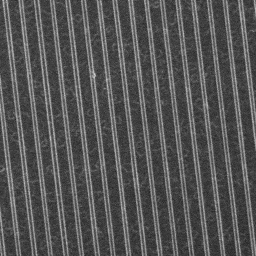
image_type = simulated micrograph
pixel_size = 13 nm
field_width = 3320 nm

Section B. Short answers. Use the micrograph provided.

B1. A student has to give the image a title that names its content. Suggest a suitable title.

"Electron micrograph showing parallel lines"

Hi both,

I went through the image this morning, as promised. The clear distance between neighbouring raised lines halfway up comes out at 151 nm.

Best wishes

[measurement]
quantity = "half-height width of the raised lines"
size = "48.3 nm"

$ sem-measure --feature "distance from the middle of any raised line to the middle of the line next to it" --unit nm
202